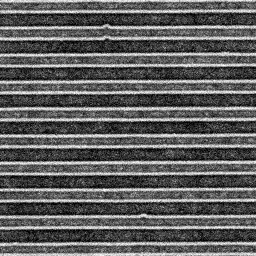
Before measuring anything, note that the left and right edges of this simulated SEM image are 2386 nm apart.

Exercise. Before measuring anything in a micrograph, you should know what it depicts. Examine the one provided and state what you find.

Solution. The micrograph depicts parallel lines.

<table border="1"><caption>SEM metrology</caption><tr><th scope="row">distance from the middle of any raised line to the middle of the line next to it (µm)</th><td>0.252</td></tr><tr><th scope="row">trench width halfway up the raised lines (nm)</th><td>150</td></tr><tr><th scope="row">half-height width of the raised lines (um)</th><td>0.108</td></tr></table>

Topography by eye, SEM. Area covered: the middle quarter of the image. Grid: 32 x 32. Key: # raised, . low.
................................
................................
................................
................................
..######################.#######
################################
################################
................................
................................
................................
................................
################################
################################
################################
................................
................................
................................
................................
################################
################################
########################........
................................
................................
................................
................................
################################
################################
................................
................................
................................
................................
.###############################